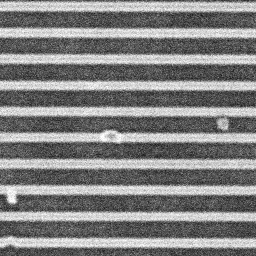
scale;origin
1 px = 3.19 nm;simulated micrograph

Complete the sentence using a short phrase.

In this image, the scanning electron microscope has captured parallel lines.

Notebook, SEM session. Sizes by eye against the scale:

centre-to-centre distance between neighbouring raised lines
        83.6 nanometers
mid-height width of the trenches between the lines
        59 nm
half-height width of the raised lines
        23.5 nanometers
